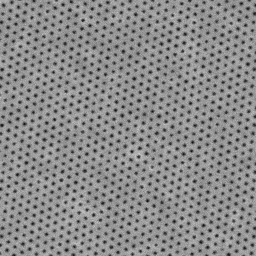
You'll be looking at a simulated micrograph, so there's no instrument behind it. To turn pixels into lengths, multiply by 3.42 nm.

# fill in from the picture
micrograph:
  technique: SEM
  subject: a regular array of holes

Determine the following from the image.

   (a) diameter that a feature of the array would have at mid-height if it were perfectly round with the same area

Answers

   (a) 11.6 nm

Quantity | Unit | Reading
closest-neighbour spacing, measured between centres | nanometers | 27.9